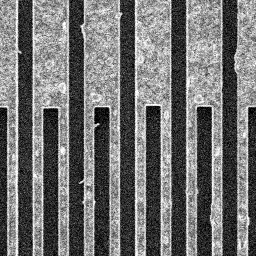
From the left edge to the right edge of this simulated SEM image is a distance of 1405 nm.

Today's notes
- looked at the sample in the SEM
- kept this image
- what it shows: parallel lines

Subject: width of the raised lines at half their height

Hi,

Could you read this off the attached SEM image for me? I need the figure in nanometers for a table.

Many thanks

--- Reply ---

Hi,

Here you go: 54.2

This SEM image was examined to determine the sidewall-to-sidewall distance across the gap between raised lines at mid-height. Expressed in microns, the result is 0.0858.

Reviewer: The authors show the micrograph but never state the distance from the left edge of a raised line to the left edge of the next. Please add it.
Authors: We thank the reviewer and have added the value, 140 nm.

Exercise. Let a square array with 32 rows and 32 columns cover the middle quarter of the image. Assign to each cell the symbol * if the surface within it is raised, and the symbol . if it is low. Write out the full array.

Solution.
*....*********....*********....*
*....*********....*********....*
*....*********....*********....*
*....*********....*********....*
*....*********....*********....*
*....*********....*********....*
*....*********....*********....*
*....*********....*********....*
*....*********....*********....*
*....*********....*********....*
*....*********....**....***....*
*....**.....**....**....***....*
*....**.....**....**....***....*
*....**.....**....**....***....*
*....**.....**....**....***....*
*....***....**....**....***....*
*....**.....**....**....***....*
*....**.....**....**....***....*
*....**.....**....**....***....*
*....**.....**....**....***....*
*....**.....**....**....***....*
*....**.....**....**....***....*
*....**.....**....**....***....*
*....**.....**....**....***....*
*....**.....**....**....***....*
*....**.....**....**....***....*
*....**.....**....**....***....*
*....**.....**....**....***....*
*....**.....**....**....***....*
*....**.....**....**....***....*
*....**.....**....**....***....*
*....**.....**....**....***....*